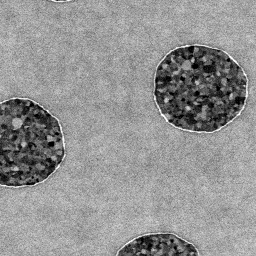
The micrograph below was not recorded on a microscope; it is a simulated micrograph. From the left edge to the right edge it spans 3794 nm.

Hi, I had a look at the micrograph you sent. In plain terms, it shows raised bodies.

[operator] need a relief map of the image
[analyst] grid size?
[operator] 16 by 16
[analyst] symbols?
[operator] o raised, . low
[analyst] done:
................
................
................
..........oooo..
..........ooooo.
..........ooooo.
oo........ooooo.
oooo......ooooo.
oooo............
oooo............
oooo............
oo..............
................
................
................
........oooo....